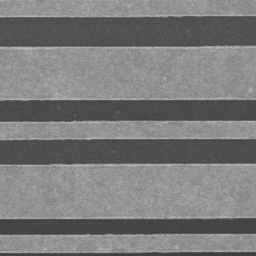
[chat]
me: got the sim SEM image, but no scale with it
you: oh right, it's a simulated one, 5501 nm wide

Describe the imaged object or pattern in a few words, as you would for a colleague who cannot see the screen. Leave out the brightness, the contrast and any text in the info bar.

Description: lines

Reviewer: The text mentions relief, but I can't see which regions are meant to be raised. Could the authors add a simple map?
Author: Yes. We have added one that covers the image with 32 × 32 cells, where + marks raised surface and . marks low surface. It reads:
++++++++++++++++++++++++++++++++
++++++++++++++++++++++++++++++++
................................
................................
................................
................................
++++++++++++++++++++++++++++++++
++++++++++++++++++++++++++++++++
++++++++++++++++++++++++++++++++
++++++++++++++++++++++++++++++++
++++++++++++++++++++++++++++++++
++++++++++++++++++++++++++++++++
................................
................................
................................
++++++++++++++++++++++++++++++++
++++++++++++++++++++++++++++++++
................................
................................
................................
................................
++++++++++++++++++++++++++++++++
++++++++++++++++++++++++++++++++
++++++++++++++++++++++++++++++++
++++++++++++++++++++++++++++++++
++++++++++++++++++++++++++++++++
++++++++++++++++++++++++++++++++
................................
................................
++++++++++++++++++++++++++++++++
++++++++++++++++++++++++++++++++
+++++++++++++++++++.++..........